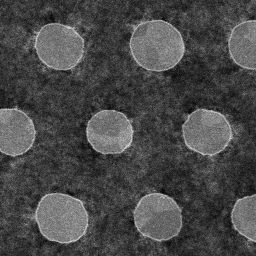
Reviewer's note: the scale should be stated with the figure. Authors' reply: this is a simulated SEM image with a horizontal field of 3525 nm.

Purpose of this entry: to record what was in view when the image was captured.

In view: raised bodies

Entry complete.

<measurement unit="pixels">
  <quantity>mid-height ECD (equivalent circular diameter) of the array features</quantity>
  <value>46.7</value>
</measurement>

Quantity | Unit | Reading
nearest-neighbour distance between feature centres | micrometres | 1.34